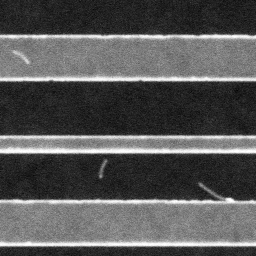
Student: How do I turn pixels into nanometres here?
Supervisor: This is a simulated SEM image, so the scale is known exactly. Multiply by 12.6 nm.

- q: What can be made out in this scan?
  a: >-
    lines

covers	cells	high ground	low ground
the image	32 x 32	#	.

................................
................................
................................
................................
###############################.
################################
################################
################################
################################
################################
................................
................................
................................
................................
................................
................................
................................
################################
################################
................................
................................
................................
................................
................................
................................
################################
################################
################################
################################
################################
################################
................................